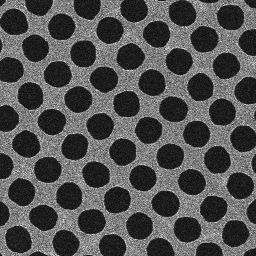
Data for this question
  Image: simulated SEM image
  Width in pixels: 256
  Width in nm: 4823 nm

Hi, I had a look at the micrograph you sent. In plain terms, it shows a regular array of holes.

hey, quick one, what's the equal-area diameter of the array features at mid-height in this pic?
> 510 nanometres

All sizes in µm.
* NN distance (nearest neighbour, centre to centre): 0.628